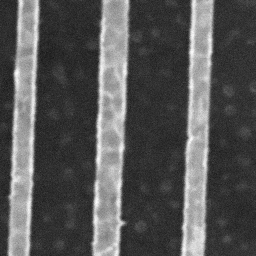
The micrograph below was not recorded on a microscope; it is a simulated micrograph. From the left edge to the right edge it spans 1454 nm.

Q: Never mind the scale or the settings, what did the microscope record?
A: one or a few lines or trenches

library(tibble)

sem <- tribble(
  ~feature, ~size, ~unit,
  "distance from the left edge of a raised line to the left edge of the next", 493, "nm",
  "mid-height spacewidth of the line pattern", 366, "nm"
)